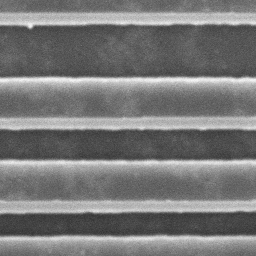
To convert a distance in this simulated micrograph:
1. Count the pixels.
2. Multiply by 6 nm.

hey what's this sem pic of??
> lines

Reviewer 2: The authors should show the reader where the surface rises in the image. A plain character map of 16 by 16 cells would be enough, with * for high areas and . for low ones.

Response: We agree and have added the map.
****************
******..***.*.**
................
................
................
****************
****************
****************
................
................
****************
****************
****************
................
................
****************